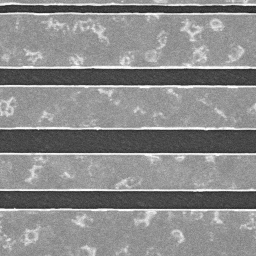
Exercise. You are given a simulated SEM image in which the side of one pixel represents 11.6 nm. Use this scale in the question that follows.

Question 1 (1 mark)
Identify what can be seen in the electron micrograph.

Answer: one or a few lines or trenches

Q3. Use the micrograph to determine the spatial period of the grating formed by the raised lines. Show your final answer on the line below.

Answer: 758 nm